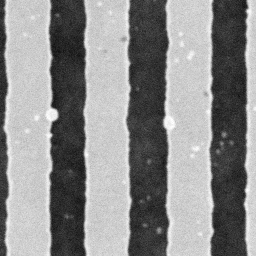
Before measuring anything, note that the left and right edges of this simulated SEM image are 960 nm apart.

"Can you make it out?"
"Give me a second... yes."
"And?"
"lines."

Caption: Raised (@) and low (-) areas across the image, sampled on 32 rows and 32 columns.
-@@@@@-----@@@@@-----@@@@@-----@
-@@@@@-----@@@@@-----@@@@@@----@
-@@@@@-----@@@@@-----@@@@@@----@
-@@@@@-----@@@@@-----@@@@@-----@
-@@@@@-----@@@@@-----@@@@@-----@
-@@@@@-----@@@@@-----@@@@@-----@
-@@@@@-----@@@@@-----@@@@@-----@
-@@@@@-----@@@@@-----@@@@@-----@
-@@@@@-----@@@@@-----@@@@@-----@
-@@@@@-----@@@@@-----@@@@@-----@
-@@@@@-----@@@@@-----@@@@@-----@
-@@@@@-----@@@@@-----@@@@@-----@
-@@@@@-----@@@@@-----@@@@@-----@
-@@@@@@----@@@@@-----@@@@@-----@
-@@@@@@----@@@@@-----@@@@@-----@
-@@@@@-----@@@@@-----@@@@@-----@
-@@@@@-----@@@@@-----@@@@@-----@
-@@@@@-----@@@@@-----@@@@@-----@
-@@@@@-----@@@@@-----@@@@@-----@
-@@@@@-----@@@@@-----@@@@@-----@
-@@@@@-----@@@@@-----@@@@@-----@
-@@@@@-----@@@@@-----@@@@@-----@
-@@@@@-----@@@@@-----@@@@@-----@
-@@@@@-----@@@@@-----@@@@@-----@
-@@@@@-----@@@@@-----@@@@@-----@
-@@@@@-----@@@@@-----@@@@@@----@
-@@@@@-----@@@@@-----@@@@@-----@
-@@@@@-----@@@@@-----@@@@@-----@
-@@@@@-----@@@@@-----@@@@@@----@
-@@@@@-----@@@@@-----@@@@@-----@
-@@@@@-----@@@@@-----@@@@@-----@
-@@@@@-----@@@@@-----@@@@@-----@